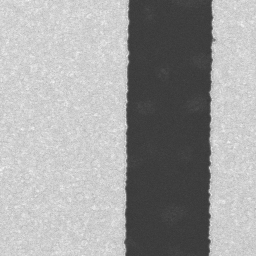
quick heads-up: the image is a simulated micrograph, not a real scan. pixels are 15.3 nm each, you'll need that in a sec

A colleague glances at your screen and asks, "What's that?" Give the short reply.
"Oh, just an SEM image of one or a few lines or trenches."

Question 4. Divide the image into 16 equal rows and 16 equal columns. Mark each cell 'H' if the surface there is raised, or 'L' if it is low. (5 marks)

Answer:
LLLLLLLLHHHHHLLL
LLLLLLLLHHHHHLLL
LLLLLLLLHHHHHLLL
LLLLLLLLHHHHHLLL
LLLLLLLLHHHHHLLL
LLLLLLLLHHHHHLLL
LLLLLLLLHHHHHLLL
LLLLLLLLHHHHHLLL
LLLLLLLLHHHHHLLL
LLLLLLLLHHHHHLLL
LLLLLLLLHHHHHLLL
LLLLLLLLHHHHHLLL
LLLLLLLLHHHHHLLL
LLLLLLLLHHHHHLLL
LLLLLLLLHHHHHLLL
LLLLLLLLHHHHHLLL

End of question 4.